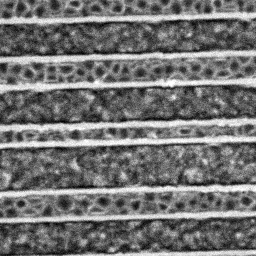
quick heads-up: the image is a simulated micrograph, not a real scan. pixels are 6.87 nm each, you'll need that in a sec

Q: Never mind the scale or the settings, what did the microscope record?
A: one or a few lines or trenches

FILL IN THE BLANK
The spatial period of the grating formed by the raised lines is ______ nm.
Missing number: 457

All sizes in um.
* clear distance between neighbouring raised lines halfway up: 0.27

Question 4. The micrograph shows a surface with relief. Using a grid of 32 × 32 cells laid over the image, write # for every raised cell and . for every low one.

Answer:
################################
################################
#########.......................
................................
................................
................................
................................
################################
################################
################################
#################...##..........
................................
................................
................................
................................
..................#.#.##########
################################
##########################......
................................
................................
................................
................................
................................
...........................#.###
################################
################################
################################
.#..............................
................................
................................
................................
................................